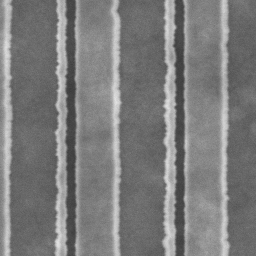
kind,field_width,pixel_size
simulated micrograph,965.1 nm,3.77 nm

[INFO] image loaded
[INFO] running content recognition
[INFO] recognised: lines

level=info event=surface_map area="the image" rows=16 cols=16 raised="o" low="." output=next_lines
....ooo...oooo..
....ooo...oooo..
....ooo...oooo..
....ooo...oooo..
....ooo...oooo..
....ooo...oooo..
....ooo...oooo..
o...ooo...oooo..
....ooo...oooo..
....ooo...oooo..
....ooo...oooo..
....ooo...oooo..
....ooo...oooo..
....ooo...oooo..
....ooo...oooo..
....ooo...oooo..